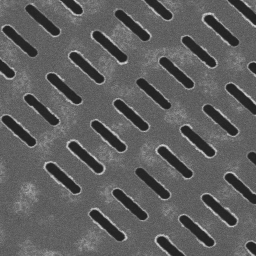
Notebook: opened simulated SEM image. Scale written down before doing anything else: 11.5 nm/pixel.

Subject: a regular array of holes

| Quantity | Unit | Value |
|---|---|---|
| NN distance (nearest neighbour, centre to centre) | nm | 355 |